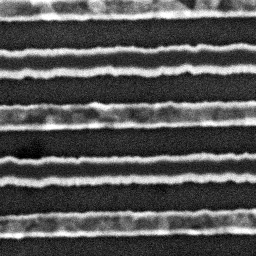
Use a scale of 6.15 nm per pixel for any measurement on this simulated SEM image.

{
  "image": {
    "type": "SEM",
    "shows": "lines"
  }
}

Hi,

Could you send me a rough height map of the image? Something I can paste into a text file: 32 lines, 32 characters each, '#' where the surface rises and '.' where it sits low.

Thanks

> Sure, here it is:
################################
################################
.#..............................
................................
................................
................................
...#..####.#####################
################################
#######################.########
................................
................................
................................
................................
################################
################################
###########################.....
................................
................................
................................
..............................#.
################################
################################
#.##########....................
................................
................................
................................
.........................#.#####
################################
################################
###.............................
................................
................................